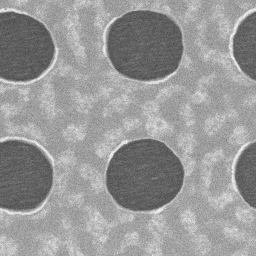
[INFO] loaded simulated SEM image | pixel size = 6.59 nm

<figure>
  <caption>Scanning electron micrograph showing holes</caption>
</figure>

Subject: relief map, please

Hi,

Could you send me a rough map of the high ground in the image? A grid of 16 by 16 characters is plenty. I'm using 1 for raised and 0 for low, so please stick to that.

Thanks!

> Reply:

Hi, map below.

1111111111111111
0001111000011110
0001111000011110
0001111000011110
0001111000011110
1111111111111111
1111111111111111
1111111111111111
1111111111111111
0001111000011110
0001111000011110
0001111000011110
0001111000011110
1111111111111111
1111111111111111
1111111111111111